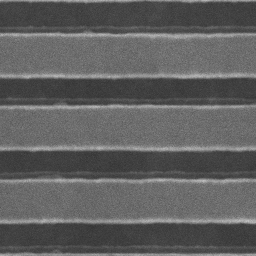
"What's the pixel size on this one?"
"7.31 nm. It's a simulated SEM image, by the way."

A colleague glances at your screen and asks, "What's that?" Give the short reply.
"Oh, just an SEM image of lines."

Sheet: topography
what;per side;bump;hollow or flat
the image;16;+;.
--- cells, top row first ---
................
................
++++++++++++++++
++++++++++++++++
++++++++++++++++
................
................
++++++++++++++++
++++++++++++++++
................
................
++++++++++++++++
++++++++++++++++
++++++++++++++++
................
................